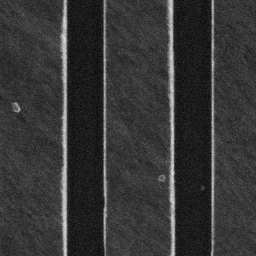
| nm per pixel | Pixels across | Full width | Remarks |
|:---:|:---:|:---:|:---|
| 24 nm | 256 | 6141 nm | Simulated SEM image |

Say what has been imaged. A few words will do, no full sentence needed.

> lines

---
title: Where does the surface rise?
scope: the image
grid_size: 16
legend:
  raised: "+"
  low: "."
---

++++...++++..+++
++++...++++..+++
++++...++++..+++
++++...++++..+++
++++...++++..+++
++++...++++..+++
++++...++++..+++
++++...++++..+++
++++...++++..+++
++++...++++..+++
++++...++++..+++
++++...++++..+++
++++...++++..+++
++++...++++..+++
++++...++++..+++
++++...++++..+++